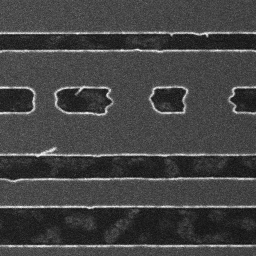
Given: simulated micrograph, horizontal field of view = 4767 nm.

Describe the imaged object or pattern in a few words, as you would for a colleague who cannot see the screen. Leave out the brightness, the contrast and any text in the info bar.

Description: one or a few lines or trenches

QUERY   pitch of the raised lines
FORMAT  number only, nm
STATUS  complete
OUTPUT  1150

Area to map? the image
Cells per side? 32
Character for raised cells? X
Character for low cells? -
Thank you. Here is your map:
XXXXXXXXXXXXXXXXXXXXXXXXXXXXXXXX
XXXXXXXXXXXXXXXXXXXXXXXXXXXXXXXX
XXXXXXXXXXXXXXXXXXXXXXXXXXXXXXXX
XXXXXXXXXXXXXXXXXXXXXXXXXXXXXXXX
--------------------------------
--------------------------------
XXXXXXXXXXXXXXXXXXXXXXXXXXXXXXXX
XXXXXXXXXXXXXXXXXXXXXXXXXXXXXXXX
XXXXXXXXXXXXXXXXXXXXXXXXXXXXXXXX
XXXXXXXXXXXXXXXXXXXXXXXXXXXXXXXX
XXXXXXXXXXXXXXXXXXXXXXXXXXXXXXXX
----XXX------XXXXXX----XXXXXX---
----XXX-------XXXXX----XXXXXX---
----XXX------XXXXXX----XXXXXX---
XXXXXXXXXXXXXXXXXXXXXXXXXXXXXXXX
XXXXXXXXXXXXXXXXXXXXXXXXXXXXXXXX
XXXXXXXXXXXXXXXXXXXXXXXXXXXXXXXX
XXXXXXXXXXXXXXXXXXXXXXXXXXXXXXXX
XXXXXXXXXXXXXXXXXXXXXXXXXXXXXXXX
-------X---XX-------X--------X--
--------------------------------
--------------------------------
X-XXXXXXXXXXXXXXXXXXXXXXXXXXXXXX
XXXXXXXXXXXXXXXXXXXXXXXXXXXXXXXX
XXXXXXXXXXXXXXXXXXXXXXXXXXXXXXXX
XXXXXXXXXXXXXXXXXXXXXXXXXXXXXXXX
--------------------------------
--------------------------------
--------------------------------
--------------------------------
--------------------------------
XXXXXXXXXXXXXXXXXXXXXXXXXXXXXXXX